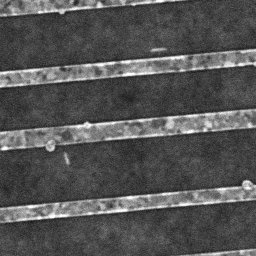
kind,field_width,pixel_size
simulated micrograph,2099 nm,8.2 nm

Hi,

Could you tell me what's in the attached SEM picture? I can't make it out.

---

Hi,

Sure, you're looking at one or a few lines or trenches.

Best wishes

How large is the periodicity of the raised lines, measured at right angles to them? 552 nm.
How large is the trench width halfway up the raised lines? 55.5 pixels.